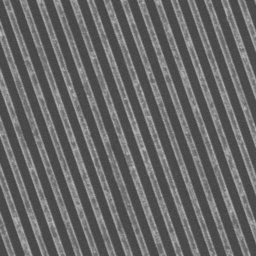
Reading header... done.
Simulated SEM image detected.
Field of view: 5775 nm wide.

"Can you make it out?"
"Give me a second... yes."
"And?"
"parallel lines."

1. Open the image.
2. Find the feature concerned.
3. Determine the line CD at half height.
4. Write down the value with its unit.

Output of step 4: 0.12 µm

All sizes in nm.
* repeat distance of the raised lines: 357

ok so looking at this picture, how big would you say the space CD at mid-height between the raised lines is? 237 nanometres